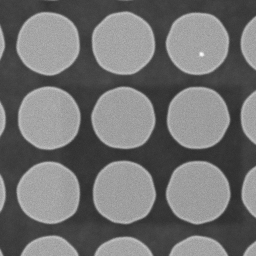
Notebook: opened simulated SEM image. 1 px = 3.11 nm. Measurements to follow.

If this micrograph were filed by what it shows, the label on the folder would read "an array of small figures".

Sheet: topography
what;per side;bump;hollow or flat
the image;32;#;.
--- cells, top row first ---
................................
................................
...######....#####....#####....#
...######...#######..#######...#
..########..#######..########.##
#.########..#######..########.##
..########..#######..#######..##
...######...#######...######...#
....####.....#####....#####.....
................................
................................
....####.....####......####.....
...######...#######...######...#
..########..#######..#######..##
#.########..#######..########.##
#.########..#######..########.##
...#######..#######..#######...#
...######....#####....#####....#
.....##.................#.......
................................
.....##.......###......###......
...######....#####....######...#
...#######..#######..#######...#
#.########..#######..########.##
#.########..#######..########.##
...#######..#######..#######...#
...######...#######...######...#
.....###......###......####.....
................................
................................
....#####....#####....#####.....
...#######..#######..#######...#